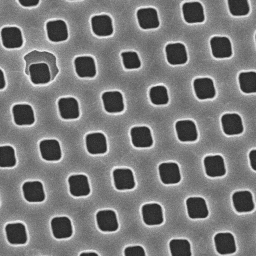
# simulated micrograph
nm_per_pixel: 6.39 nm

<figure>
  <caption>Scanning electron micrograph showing a regular array of holes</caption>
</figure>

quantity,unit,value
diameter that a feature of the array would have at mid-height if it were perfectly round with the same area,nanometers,147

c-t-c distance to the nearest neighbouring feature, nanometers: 287